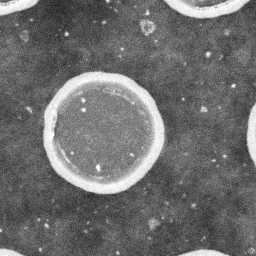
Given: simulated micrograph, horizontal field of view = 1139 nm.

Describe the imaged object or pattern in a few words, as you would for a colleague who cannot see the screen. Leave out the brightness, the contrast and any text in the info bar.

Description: raised bodies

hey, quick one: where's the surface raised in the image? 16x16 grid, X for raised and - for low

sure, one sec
X----------XXX--
----------------
----------------
----------------
----------------
----XXXXX-------
---XXXXXX-------
---XXXXXXX------
---XXXXXXX------
---XXXXXXX------
----XXXXX-------
-----XXX--------
----------------
----------------
----------------
----------------